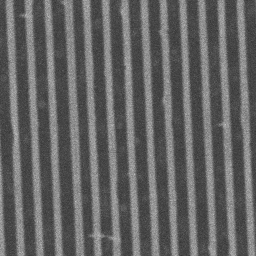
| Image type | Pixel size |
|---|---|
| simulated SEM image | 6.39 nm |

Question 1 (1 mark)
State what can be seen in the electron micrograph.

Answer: parallel lines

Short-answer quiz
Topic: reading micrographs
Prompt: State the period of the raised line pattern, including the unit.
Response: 123 nanometers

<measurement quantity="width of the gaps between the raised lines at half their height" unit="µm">0.0789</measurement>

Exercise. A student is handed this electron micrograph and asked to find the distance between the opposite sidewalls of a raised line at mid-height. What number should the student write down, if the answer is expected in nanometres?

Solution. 42.3